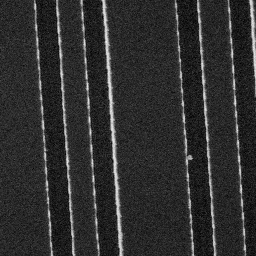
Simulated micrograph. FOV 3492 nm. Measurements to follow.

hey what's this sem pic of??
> lines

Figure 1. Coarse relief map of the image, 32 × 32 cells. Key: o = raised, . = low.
oooo...ooo...ooooooooo...oooo..o
oooo...ooo...ooooooooo...oooo..o
oooo...ooo...ooooooooo...oooo...
ooooo..ooo...ooooooooo...oooo...
ooooo..ooo...ooooooooo...oooo...
ooooo..oooo..ooooooooo...oooo...
ooooo...ooo..ooooooooo...oooo...
ooooo...ooo..oooooooooo..oooo...
ooooo...ooo...ooooooooo..oooo...
ooooo...ooo...ooooooooo..oooo...
ooooo...ooo...ooooooooo..oooo...
ooooo...ooo...ooooooooo..oooo...
ooooo...ooo...ooooooooo..oooo...
ooooo...ooo...ooooooooo...ooo...
ooooo...ooo...ooooooooo...oooo..
ooooo...ooo...ooooooooo...oooo..
ooooo...ooo...ooooooooo...oooo..
oooooo..ooo...ooooooooo...oooo..
oooooo..ooo...ooooooooo...oooo..
oooooo..ooo...ooooooooo...oooo..
oooooo..oooo..ooooooooo...oooo..
oooooo...ooo..oooooooooo..oooo..
oooooo...ooo...ooooooooo..oooo..
oooooo...ooo...ooooooooo..oooo..
oooooo...ooo...ooooooooo..oooo..
oooooo...ooo...ooooooooo..oooo..
oooooo...ooo...ooooooooo..oooo..
oooooo...ooo...ooooooooo...ooo..
oooooo...ooo...ooooooooo...oooo.
oooooo...ooo...ooooooooo...oooo.
oooooo...ooo...ooooooooo...oooo.
ooooooo..ooo...ooooooooo...oooo.